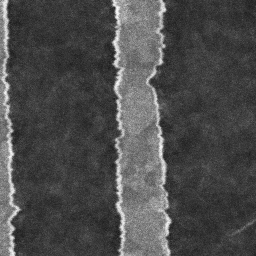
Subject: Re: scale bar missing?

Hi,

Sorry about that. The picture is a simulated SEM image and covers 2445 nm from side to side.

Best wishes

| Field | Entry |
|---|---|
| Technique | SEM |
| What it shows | one or a few lines or trenches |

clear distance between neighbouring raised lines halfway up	1050	nm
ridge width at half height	0.415	micrometres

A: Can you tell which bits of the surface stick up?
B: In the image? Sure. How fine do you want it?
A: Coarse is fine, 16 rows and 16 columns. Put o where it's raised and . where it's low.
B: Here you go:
.......ooo......
.......ooo......
.......ooo......
.......ooo......
.......ooo......
.......oo.......
.......ooo......
o......ooo......
o.......oo......
o......ooo......
o......ooo......
o......ooo......
o......ooo......
o.......oo......
o.......oo......
o.......oo......